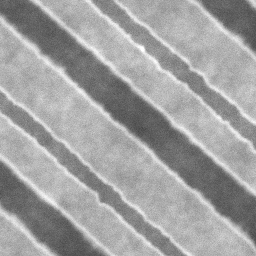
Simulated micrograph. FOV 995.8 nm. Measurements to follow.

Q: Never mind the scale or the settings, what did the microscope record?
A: lines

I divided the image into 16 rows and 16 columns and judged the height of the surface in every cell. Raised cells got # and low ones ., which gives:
...##########...
....##########..
#....##########.
###...##########
####...#########
#####...########
######....######
#######....#####
########....####
#########....###
.#########....##
..##########...#
...##########...
#...##########..
##...##########.
###...##########